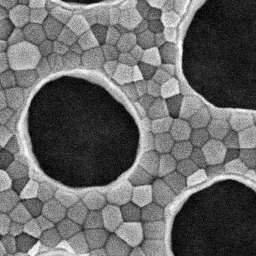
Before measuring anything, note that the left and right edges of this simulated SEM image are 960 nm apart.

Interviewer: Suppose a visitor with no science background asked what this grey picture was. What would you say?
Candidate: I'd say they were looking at holes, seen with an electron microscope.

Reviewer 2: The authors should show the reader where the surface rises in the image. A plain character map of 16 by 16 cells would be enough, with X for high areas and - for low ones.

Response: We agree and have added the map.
XXXXXXXXXXXX----
XXXXXXXXXXXX----
XXXXXXXXXXX-----
XXXXXXXXXXX-----
XXXXXXXXXXX-----
XXX----XXXXX----
XX------XXXXX---
XX------XXXXXXXX
XX-------XXXXXXX
XX-------XXXXXXX
XX------XXXXXXXX
XXXX---XXXXXX--X
XXXXXXXXXXXX----
XXXXXXXXXXX-----
XXXXXXXXXXX-----
XXXXXXXXXXX-----